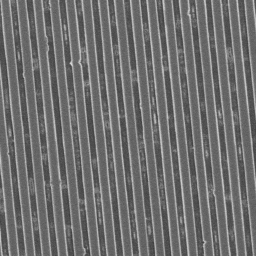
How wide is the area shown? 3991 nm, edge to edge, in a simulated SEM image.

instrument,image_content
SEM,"parallel lines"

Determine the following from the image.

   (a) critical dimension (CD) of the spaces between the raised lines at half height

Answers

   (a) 105 nm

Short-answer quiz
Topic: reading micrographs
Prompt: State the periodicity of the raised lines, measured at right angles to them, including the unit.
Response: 252 nanometers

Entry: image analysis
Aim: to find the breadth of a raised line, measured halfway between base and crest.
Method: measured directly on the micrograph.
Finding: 0.143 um